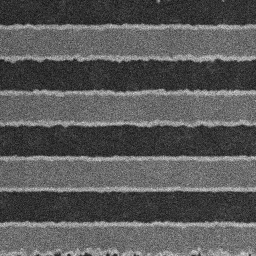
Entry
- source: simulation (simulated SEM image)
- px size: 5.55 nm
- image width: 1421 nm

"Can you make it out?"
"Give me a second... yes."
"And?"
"one or a few lines or trenches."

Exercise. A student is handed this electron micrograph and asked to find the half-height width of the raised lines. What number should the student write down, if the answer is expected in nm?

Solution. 175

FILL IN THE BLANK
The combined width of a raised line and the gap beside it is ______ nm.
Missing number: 364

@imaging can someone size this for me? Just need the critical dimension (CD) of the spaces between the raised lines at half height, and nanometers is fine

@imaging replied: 190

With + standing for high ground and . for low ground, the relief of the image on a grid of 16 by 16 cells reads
................
................
++++++++++++++++
++++++++++++++++
................
................
++++++++++++++++
++++++++++++++++
................
................
++++++++++++++++
++++++++++++++++
................
................
++++++++++++++++
++++++++++++++++